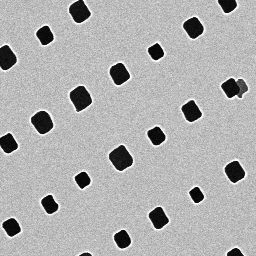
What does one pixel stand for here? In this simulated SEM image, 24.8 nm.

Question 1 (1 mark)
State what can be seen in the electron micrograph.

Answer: a regular array of holes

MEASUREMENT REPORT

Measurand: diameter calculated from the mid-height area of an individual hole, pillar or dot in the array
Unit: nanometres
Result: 447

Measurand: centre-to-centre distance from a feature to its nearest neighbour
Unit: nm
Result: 1060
